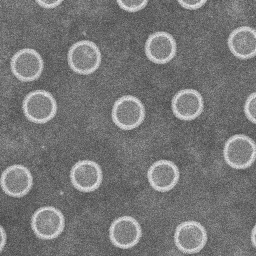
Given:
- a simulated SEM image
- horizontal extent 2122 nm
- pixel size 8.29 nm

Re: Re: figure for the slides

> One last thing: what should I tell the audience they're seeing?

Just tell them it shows a regular array of raised bodies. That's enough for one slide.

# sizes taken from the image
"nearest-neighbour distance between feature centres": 0.495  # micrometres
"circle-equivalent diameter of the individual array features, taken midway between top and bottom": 0.246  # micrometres